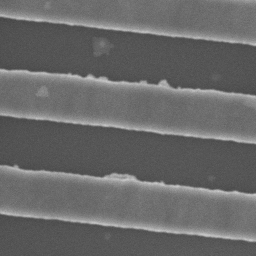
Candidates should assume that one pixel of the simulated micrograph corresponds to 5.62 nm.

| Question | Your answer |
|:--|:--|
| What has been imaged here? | lines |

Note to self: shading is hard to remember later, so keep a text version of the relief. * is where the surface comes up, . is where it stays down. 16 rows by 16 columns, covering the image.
****************
....************
.............***
................
**..............
***********.....
****************
...*************
............****
................
*...............
**********......
****************
.***************
..........******
................